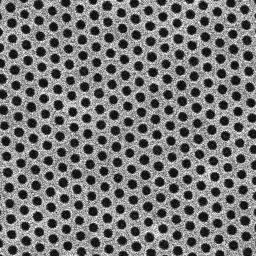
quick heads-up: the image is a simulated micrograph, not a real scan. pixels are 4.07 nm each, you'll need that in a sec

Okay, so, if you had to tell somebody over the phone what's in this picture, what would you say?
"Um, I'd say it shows a regular array of holes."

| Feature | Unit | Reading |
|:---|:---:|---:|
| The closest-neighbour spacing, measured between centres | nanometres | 62.2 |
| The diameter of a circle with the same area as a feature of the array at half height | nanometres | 38.4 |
